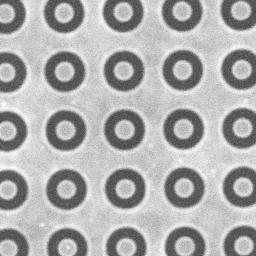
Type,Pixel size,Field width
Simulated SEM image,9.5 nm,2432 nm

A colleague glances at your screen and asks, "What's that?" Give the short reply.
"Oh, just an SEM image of an array of small figures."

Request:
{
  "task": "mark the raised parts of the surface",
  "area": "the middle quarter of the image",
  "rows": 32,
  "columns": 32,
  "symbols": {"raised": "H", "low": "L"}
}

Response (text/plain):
HHLLLLHHHHLLLHHHLLLLHHHHLLLLHHHL
HHLLLLHHHHLLLHHHHLLLHHHHLLLLHHHH
HHLLLLHHHHLLLHHHHLLLHHHHLLLLHHHL
HHLLLHHHHHLLLLHHLLLLHHHHHLLLLHHL
LLLLLHHHHHLLLLLLLLLLHHHHHLLLLLLL
LLLLHHHHHHHLLLLLLLLHHHHHHHLLLLLL
LLLHHHHHHHHHLLLLLLHHHHHHHHHHLLLL
HHHHHHHHHHHHHHHHHHHHHHHHHHHHHHHH
HHHHHHHHHHHHHHHHHHHHHHHHHHHHHHHH
HHHHHHHHHHHHHHHHHHHHHHHHHHHHHHHH
HHHHHHHHHHHHHHHHHHHHHHHHHHHHHHHH
LLHHHHHHHHHHHLLLLLHHHHHHHHHLLLLL
LLLLHHHHHHHLLLLLLLLHHHHHHHLLLLLL
LLLLLHHHHHHLLLLLLLLLHHHHHLLLLLLL
HLLLLHHHHHLLLLHHLLLLHHHHHLLLLHHL
HHLLLLHHHHLLLHHHHLLLHHHHHLLLHHHH
HHLLLLHHHLLLLHHHHLLLLHHHLLLLHHHH
HHLLLLHHHHLLLHHHHLLLHHHHHLLLHHHH
HLLLLLHHHHLLLLLLLLLLHHHHHLLLLLLL
LLLLLHHHHHHLLLLLLLLLHHHHHHLLLLLL
LLLLHHHHHHHHLLLLLLLHHHHHHHHLLLLL
LLLHHHHHHHHHHLLLLHHHHHHHHHHHLLLL
HHHHHHHHHHHHHHHHHHHHHHHHHHHHHHHH
HHHHHHHHHHHHHHHHHHHHHHHHHHHHHHHH
HHHHHHHHHHHHHHHHHHHHHHHHHHHHHHHH
HHHHHHHHHHHHHHHHHHHHHHHHHHHHHHLH
LLLHHHHHHHHHHLLLLLHHHHHHHHHLLLLL
LLLLLHHHHHHLLLLLLLLHHHHHHHLLLLLL
LLLLLHHHHHHLLLLLLLLLHHHHHLLLLLLL
HHLLLLHHHHLLLLHHHLLLLHHHHLLLLHHH
HHHLLLHHHHLLLHHHHLLLLHHHHLLLHHHH
HHHLLLHHHHLLLHHHHLLLLHHHHLLLHHHH